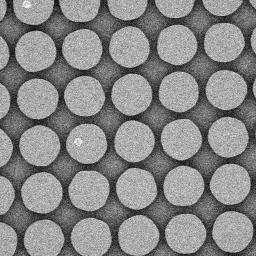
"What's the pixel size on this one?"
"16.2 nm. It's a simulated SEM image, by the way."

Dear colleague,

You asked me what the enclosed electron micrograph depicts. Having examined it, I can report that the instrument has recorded an array of small figures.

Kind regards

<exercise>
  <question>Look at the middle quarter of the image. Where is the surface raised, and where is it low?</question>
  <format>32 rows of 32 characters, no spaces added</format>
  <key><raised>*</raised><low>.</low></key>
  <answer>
..*****........***..............
................................
...........................****.
...****.......******.....*******
..*******....********...********
.********...**********..********
**********..**********..********
**********..**********..********
**********..**********..********
**********..**********..********
.*********...********....*******
..*******.....******.......****.
...*****.......***..............
................................
................***........*****
...*****......*******....*******
..*******.....********...*******
.*********...*********..********
.*********...*********..********
.**********..**********.********
.**********..*********...*******
.*********...*********...*******
.*********....*******.....******
..*******......*****.......****.
....****........................
................................
................****.......*****
...******......*******....******
...*******....********...*******
..*********..**********..*******
.**********..**********..*******
.**********..**********..*******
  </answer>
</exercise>